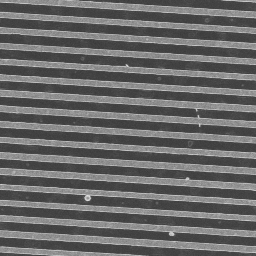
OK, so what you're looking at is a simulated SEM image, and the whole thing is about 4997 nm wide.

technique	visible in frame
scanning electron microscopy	parallel lines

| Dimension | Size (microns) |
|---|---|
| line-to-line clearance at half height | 0.185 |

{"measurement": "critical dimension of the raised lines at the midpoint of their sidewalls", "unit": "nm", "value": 119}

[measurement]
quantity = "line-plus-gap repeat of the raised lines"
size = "305 nm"